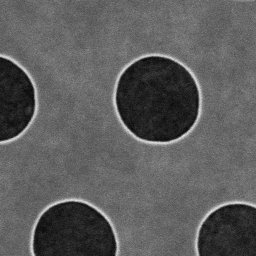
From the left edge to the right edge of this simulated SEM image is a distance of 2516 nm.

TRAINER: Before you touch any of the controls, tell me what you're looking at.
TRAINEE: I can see holes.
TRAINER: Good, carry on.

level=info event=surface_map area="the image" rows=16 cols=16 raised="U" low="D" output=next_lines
UUUUUUUUUUUUUUUU
UUUUUUUUUUUUUUUU
UUUUUUUUUUUUUUUU
UUUUUUUUUUUUUUUU
DUUUUUUUDDDDUUUU
DDUUUUUDDDDDUUUU
DDUUUUUDDDDDUUUU
DDUUUUUUDDDDUUUU
DUUUUUUUUDDUUUUU
UUUUUUUUUUUUUUUU
UUUUUUUUUUUUUUUU
UUUUUUUUUUUUUUUU
UUUUUUUUUUUUUUUU
UUUDDDUUUUUUUDDD
UUDDDDDUUUUUDDDD
UUDDDDDUUUUUDDDD